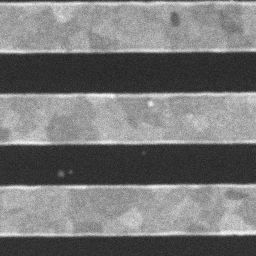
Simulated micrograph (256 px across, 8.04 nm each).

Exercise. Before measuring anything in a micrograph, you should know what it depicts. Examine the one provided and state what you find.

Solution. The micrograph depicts wiring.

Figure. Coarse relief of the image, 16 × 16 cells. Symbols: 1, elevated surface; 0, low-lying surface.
1111111111111111
1111111111111111
1111111111111111
0000000000000000
0000000000000000
0000000000000000
1111111111111111
1111111111111111
1111111111111111
0000000000000000
0000000000000000
0000000000000000
1111111111111111
1111111111111111
1111111111111100
0000000000000000